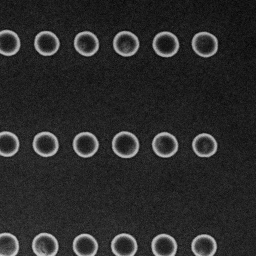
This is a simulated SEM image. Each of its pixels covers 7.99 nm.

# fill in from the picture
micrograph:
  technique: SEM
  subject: a regular array of raised bodies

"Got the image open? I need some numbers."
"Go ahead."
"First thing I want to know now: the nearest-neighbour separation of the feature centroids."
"314 nm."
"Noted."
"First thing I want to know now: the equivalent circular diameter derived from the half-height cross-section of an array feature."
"190 nm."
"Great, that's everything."